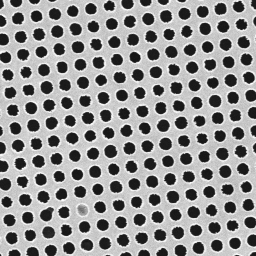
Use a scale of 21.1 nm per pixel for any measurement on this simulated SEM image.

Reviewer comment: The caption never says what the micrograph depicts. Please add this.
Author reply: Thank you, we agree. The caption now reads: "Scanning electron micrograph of a regular array of holes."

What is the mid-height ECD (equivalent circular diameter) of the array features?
12.1 px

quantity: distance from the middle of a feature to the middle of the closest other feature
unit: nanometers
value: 375